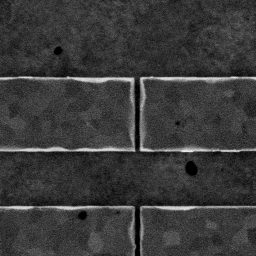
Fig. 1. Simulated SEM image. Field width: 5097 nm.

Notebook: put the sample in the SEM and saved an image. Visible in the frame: wiring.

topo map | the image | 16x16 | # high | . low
................
................
................
................
................
########.#######
################
################
################
................
................
................
................
################
################
################